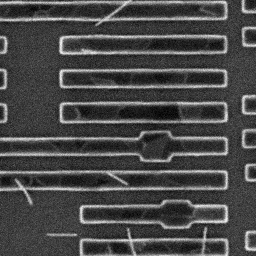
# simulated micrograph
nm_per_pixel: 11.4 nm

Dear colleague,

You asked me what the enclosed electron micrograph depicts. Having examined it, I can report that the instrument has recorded wiring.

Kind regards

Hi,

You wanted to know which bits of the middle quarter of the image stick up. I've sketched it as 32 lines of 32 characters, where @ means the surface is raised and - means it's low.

--------------------------------
-----------------@@@@@---@@@@@@@
@@@@@@@@@@@@@@@@@@@@@@@@@@@@@@@@
@@@@@@@@@@@@@@@@@@@@@@@@@@@@@@@@
@@@@@@@@@@@@@@@@@@@@@@@@@@@@@@@@
@@@@@@@@@@@@@@@@@@@@@@@@@@@@@@@@
--------------------------------
--------------------------------
--------------------------------
--------------------------------
@@@@@@@@@@@@@@@@@@@@@@@@@@@@@@@@
@@@@@@@@@@@@@@@@@@@@@@@@@@@@@@@@
@@@@@@@@@@@@@@@@@@@@@@@@@@@@@@@@
@@@@@@@@@@@@@@@@@@@@@@@@@@@@@@@@
@@@@@@@@@@@@@@@@@@@@@@@@@@@@@@@@
--------------------------------
--------------------------------
-------------------@@@@@@@@-----
------------------@@@@@@@@@@@@@@
@@@@@@@@@@@@@@@@@@@@@@@@@@@@@@@@
@@@@@@@@@@@@@@@@@@@@@@@@@@@@@@@@
@@@@@@@@@@@@@@@@@@@@@@@@@@@@@@@@
@@@@@@@@@@@@@@@@@@@@@@@@@@@@@@@@
-------------------@@@@@@@@-----
--------------------------------
--------------------------------
--------------------------------
@@@@@@@@@@@@@@@@@@@@@@@@@@@@@@@@
@@@@@@@@@@@@@@@@@@@@@@@@@@@@@@@@
@@@@@@@@@@@@@@@@@@@@@@@@@@@@@@@@
@@@@@@@@@@@@@@@@@@@@@@@@@@@@@@@@
--------------------------------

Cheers